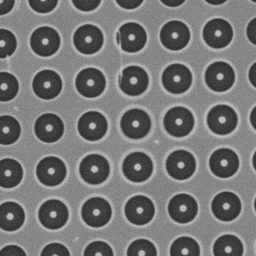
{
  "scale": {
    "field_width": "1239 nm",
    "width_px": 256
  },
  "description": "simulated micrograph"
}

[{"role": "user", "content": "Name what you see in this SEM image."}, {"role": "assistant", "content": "an array of small figures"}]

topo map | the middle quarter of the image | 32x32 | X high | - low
XXXXXXXXXXXXXXXX---XXXXXXX-----X
XXXX-----XXXXXX-----XXXXX-------
XXX-------XXXX-------XXX--------
XXX-------XXX----X---XXX---XX---
XXX---X----XX----X---XXX--------
XXX--------XX--------XXXX-------
XXX-------XXXX-------XXXX------X
XXXX------XXXXX-----XXXXXXX---XX
XXXXXX--XXXXXXXXXXXXXXXXXXXXXXXX
XXXXXXXXXXXXXXXXXXXXXXXXXXXXXXXX
XXXXXXXXXXXXXXXXXXXXXXXXXXXX--XX
XXXXXXX-XXXXXXXX----XXXXXX------
XXXXX-----XXXX-------XXXX-------
XXXX-------XXX--------XXX-------
XXX--------XXX---X----XX----XX--
XXX---XX---XXX--------XXX-------
XXX--------XXX--------XXX-------
XXXX-------XXX-------XXXXX------
XXXX------XXXXXX----XXXXXXXX-XXX
XXXXXXX-XXXXXXXXXXXXXXXXXXXXXXXX
XXXXXXXXXXXXXXXXXXXXXXXXXXXXXXXX
XXXXXXXXXXXXXXXXXX-XXXXXXXX----X
XXXXXX---XXXXXXX-----XXXXX------
XXXXX------XXXX-------XXXX------
XXXX-------XXX--------XXX-------
-XXX--------XX----X----XX---XX--
-XXX---X----XX----X----XX-------
-XXX--------XXX-------XXXX------
-XXX-------XXXX------XXXXXX----X
XXXXX-----XXXXXXX---XXXXXXXXXXXX
XXXXXXXXXXXXXXXXXXXXXXXXXXXXXXXX
XXXXXXXXXXXXXXXXXXXXXXXXXXXXXXXX